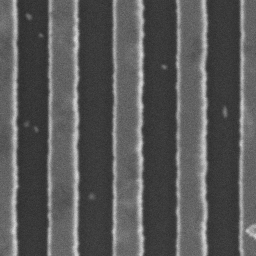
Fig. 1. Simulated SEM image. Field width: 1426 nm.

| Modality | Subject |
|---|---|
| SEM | lines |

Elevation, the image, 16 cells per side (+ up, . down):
+..++..++..++..+
+..++..++..++..+
+..++..++..++..+
+..++..++..++..+
+..++..++..++..+
+..++..++..++..+
+..++..++..++..+
+..++..++..++..+
+..++..++..++..+
+..++..++..++..+
+..++..++..++..+
+..++..++..++..+
+..++..++..++..+
+..++..++..++..+
+..++..++..++..+
+..++..++..++..+